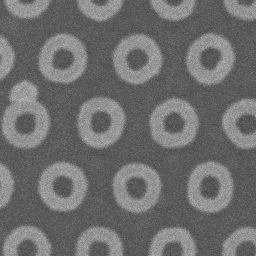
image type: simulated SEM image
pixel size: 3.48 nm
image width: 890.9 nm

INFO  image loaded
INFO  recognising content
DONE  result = a regular array of ring-shaped raised bodies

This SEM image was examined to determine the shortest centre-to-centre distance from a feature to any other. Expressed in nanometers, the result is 254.